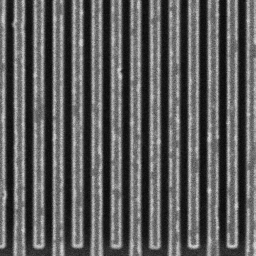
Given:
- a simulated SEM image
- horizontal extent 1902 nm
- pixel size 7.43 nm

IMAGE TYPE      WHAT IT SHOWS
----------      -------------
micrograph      parallel lines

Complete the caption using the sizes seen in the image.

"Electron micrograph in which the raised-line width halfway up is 82.6 nm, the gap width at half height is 0.064 µm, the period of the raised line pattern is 144 nm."